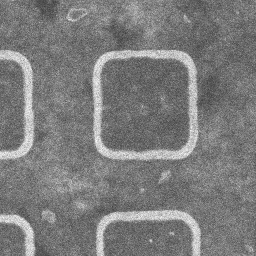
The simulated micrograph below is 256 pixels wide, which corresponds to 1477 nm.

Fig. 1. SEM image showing raised bodies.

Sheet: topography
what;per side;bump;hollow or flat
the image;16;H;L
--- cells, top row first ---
LLLLLLLLLLLLLLLL
LLLLLLLLLLLLLLLL
LLLLLLLLLLLLLLLL
LLLLLLLHHHHLLLLL
HHLLLLHHHHHHLLLL
HHLLLLHHHHHHLLLL
HHLLLLHHHHHHLLLL
HHLLLLHHHHHHLLLL
HHLLLLHHHHHHLLLL
HLLLLLLHHHHLLLLL
LLLLLLLLLLLLLLLL
LLLLLLLLLLLLLLLL
LLLLLLLLLLLLLLLL
LLLLLLLHHHHLLLLL
HHLLLLHHHHHHLLLL
HHLLLLHHHHHHLLLL